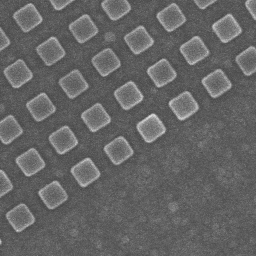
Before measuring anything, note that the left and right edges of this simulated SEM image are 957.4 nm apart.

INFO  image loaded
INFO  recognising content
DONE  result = a regular array of raised bodies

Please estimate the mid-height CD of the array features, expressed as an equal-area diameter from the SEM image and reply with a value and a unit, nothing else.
94.4 nm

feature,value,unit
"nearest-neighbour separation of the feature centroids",148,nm